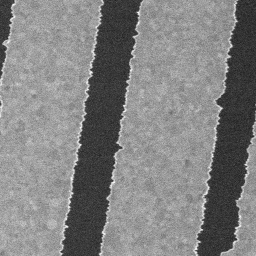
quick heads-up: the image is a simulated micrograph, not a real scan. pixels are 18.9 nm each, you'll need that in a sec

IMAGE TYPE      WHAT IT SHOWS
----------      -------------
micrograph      one or a few lines or trenches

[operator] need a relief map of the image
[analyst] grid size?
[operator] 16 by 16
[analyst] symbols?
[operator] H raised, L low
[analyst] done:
LHHHHHLLLHHHHHHL
LHHHHHLLLHHHHHHL
HHHHHHLLHHHHHHLL
HHHHHHLLHHHHHHLL
HHHHHHLLHHHHHHLL
HHHHHLLLHHHHHHLL
HHHHHLLLHHHHHHLL
HHHHHLLLHHHHHHLL
HHHHHLLHHHHHHLLL
HHHHHLLHHHHHHLLL
HHHHHLLHHHHHHLLH
HHHHLLLHHHHHHLLH
HHHHLLLHHHHHHLLH
HHHHLLLHHHHHHLLH
HHHHLLHHHHHHLLLH
HHHHLLHHHHHHLLHH